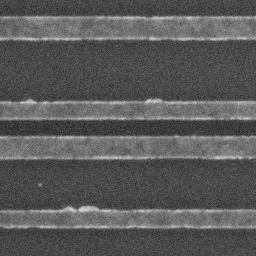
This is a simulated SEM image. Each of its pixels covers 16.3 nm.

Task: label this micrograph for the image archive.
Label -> lines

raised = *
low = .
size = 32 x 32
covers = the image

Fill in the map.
................................
................................
********************************
********************************
********************************
................................
................................
................................
................................
................................
................................
................................
................................
********************************
********************************
................................
................................
********************************
********************************
********************************
................................
................................
................................
................................
................................
................................
********************************
********************************
................................
................................
................................
................................